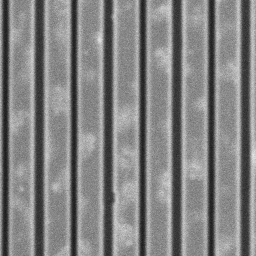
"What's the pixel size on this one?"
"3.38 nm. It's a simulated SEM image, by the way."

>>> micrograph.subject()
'parallel lines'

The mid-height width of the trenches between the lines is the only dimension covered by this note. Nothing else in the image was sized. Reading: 0.0317 µm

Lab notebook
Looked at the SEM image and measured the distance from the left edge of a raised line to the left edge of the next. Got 116 nanometres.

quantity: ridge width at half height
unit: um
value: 0.087